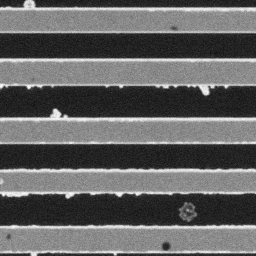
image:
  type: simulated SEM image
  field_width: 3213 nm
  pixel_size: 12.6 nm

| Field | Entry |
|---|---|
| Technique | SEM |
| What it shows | lines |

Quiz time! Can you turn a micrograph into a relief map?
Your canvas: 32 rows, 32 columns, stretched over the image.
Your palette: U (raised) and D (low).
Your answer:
DDDUDDDDDDDDDDDDDDDDDDDDDDDDDDDD
UUUUUUUUUUUUUUUUUUUUUUUUUUUUUUUU
UUUUUUUUUUUUUUUUUUUUUUUUUUUUUUUU
UUUUUUUUUUUUUUUUUUUUUUUUUUUUUUUU
DDDDDDDDDDDDDDDDDDDDDDDDDDDDDDDD
DDDDDDDDDDDDDDDDDDDDDDDDDDDDDDDD
DDDDDDDDDDDDDDDDDDDDDDDDDDDDDDDD
UUUUUUUDUUUUUUUUUUUUUUUUDUUUUUDU
UUUUUUUUUUUUUUUUUUUUUUUUUUUUUUUU
UUUUUUUUUUUUUUUUUUUUUUUUUUUUUUUU
UUUUUUUUUUUUUUUUUUUUUUUUUUUUUUUU
DDDDDDDDDDDDDDDDDDDDDDDDDDDDDDDD
DDDDDDDDDDDDDDDDDDDDDDDDDDDDDDDD
DDDDDDDDDDDDDDDDDDDDDDDDDDDDDDDD
DDDDDDDDDDDDDDDDDDDDDDDDDDDDDDDD
UUUUUUUUUUUUUUUUUUUUUUUUUUUUUUUU
UUUUUUUUUUUUUUUUUUUUUUUUUUUUUUUU
UUUUUUUUUUUUUUUUUUUUUUUUUUUUUUUU
DDDDDDDDDDDDDDDDDDDDDDDDDDDDDDDD
DDDDDDDDDDDDDDDDDDDDDDDDDDDDDDDD
DDDDDDDDDDDDDDDDDDDDDDDDDDDDDDDD
UUUUUUUUUUUUUUUUUUUUUUUUUUUUUUUU
UUUUUUUUUUUUUUUUUUUUUUUUUUUUUUUU
UUUUUUUUUUUUUUUUUUUUUUUUUUUUUUUU
DDDDDDDDDDDDDDDDDDDDDDDDDDDDDDDD
DDDDDDDDDDDDDDDDDDDDDDDDDDDDDDDD
DDDDDDDDDDDDDDDDDDDDDDDDDDDDDDDD
DDDDDDDDDDDDDDDDDDDDDDDDDDDDDDDD
UUUUUUUUUUUUUUUUUUUUUUUUUUUUUUUU
UUUUUUUUUUUUUUUUUUUUUUUUUUUUUUUU
UUUUUUUUUUUUUUUUUUUUUUUUUUUUUUUU
UUUUUUUUUUUUUUUUUUUUUUUUUUUUUUUU